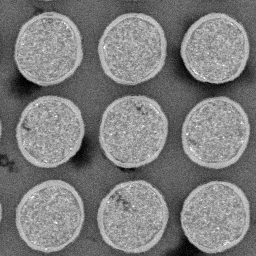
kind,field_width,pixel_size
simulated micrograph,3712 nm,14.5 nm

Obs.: a regular array of raised bodies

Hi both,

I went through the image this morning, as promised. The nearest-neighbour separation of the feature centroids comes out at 1190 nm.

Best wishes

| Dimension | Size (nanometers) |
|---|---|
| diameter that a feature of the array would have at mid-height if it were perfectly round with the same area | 957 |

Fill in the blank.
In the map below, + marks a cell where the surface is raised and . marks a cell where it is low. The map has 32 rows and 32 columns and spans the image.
................................
................................
....++++.......++++......++++...
...++++++.....++++++....++++++..
...+++++++...+++++++....+++++++.
..++++++++...+++++++...++++++++.
..++++++++...+++++++...++++++++.
..++++++++...+++++++...++++++++.
..+++++++....+++++++....++++++..
...+++++......+++++.....+++++...
................................
................................
.....+++.......++++.......++....
....+++++.....++++++.....+++++..
...+++++++...+++++++....++++++..
..++++++++...++++++++..++++++++.
..++++++++...++++++++..++++++++.
..++++++++...+++++++...++++++++.
...++++++....+++++++...+++++++..
....+++++.....+++++.....++++++..
.....++........+++.......+++....
................................
................................
.....++++......++++......++++...
....++++++....++++++....++++++..
...+++++++...+++++++...++++++++.
..++++++++...++++++++..++++++++.
..++++++++...++++++++..++++++++.
...+++++++...+++++++...++++++++.
...++++++....+++++++...+++++++..
....++++......+++++.....+++++...
................................